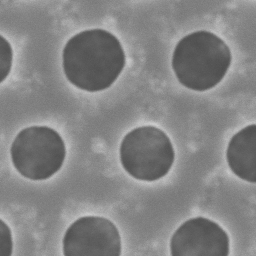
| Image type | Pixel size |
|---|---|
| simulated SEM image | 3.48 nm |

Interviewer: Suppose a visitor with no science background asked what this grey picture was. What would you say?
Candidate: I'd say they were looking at holes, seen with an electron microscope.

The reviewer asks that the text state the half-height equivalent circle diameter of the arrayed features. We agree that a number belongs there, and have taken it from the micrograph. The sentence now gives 200 nm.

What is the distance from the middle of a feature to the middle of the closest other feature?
375 nm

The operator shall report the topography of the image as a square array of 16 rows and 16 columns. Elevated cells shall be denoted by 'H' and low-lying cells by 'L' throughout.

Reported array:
HHHHHHHHHHHHHHHH
HHHHHHHHHHHHHHHH
HHHHLLLHHHHLLLHH
LHHHLLLLHHHLLLHH
LHHHLLLLHHHLLLHH
HHHHHLLHHHHHLHHH
HHHHHHHHHHHHHHHH
HHHHHHHHHHHHHHHH
HLLLHHHHLLHHHHHL
HLLLHHHLLLLHHHLL
HLLLHHHHLLLHHHLL
HHHHHHHHHHHHHHHH
HHHHHHHHHHHHHHHH
HHHHHHHHHHHHHHHH
LHHHLLLHHHHLLLHH
LHHHLLLLHHHLLLHH